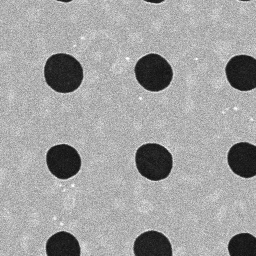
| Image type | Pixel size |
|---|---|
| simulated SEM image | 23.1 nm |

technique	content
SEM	holes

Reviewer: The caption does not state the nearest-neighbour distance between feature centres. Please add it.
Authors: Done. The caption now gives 2040 nm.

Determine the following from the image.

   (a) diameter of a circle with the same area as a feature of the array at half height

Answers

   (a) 878 nanometers